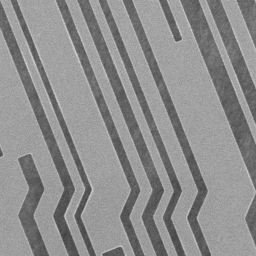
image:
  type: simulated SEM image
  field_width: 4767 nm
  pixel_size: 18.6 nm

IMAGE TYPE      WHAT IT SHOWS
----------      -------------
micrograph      groups of lines, slits or small figures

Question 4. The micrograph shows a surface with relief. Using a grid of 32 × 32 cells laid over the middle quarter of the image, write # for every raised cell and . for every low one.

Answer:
####...###...##..####...########
#####..###...##...####..########
#####...##....##..####..########
######..###...##..####...#######
######...##...###..####..#######
######...###...##..####...######
#######..###...##...###...######
#######...##....##..####...#####
#######...###...##..####...#####
########..###...###..####..#####
########...###...##..####...####
#########..###...##...###...####
#########...##....##..####..####
##########..###...##..####...###
##########..###...###..####..###
.#########...###...##..####...##
.##########..###...##...###...##
..#########...##....##..####..##
..#########...###...##..####...#
#.##########..###...###..####..#
#..#########...###...##..####...
#..##########..###...##...###...
##..#########...##....##..####..
##..#########...###...##..####..
###.##########..###...###..####.
.##..#########...###...##..####.
.##..##########..###...##...###.
.###..#########...##....##..####
..##..##########..###...##..####
..##..##########..###...##...###
...##..#########...###...##..###
...##..#########...###...##..###